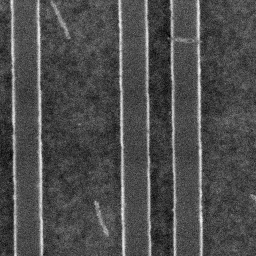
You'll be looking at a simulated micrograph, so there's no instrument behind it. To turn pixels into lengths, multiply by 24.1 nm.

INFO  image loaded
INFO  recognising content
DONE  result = lines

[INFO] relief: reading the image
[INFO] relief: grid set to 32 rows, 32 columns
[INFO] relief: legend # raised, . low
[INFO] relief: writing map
.####..........###...####.......
..###..........###...####.......
..###..........###...####.......
..###..........###...####.......
..###..........###...####.......
..###..........###...####.......
..###..........###...####.......
..###..........###...####.......
..###..........###...####.......
..###..........###....###.......
..###..........###....###.......
..###..........###....###.......
..###..........####...###.......
..###..........####...###.......
..###..........####...###.......
..###..........####...###.......
..###..........####...###.......
..###..........####...###.......
..###..........####...###.......
..###..........####...###.......
..###..........####...###.......
..###..........####...###.......
..###..........####...###.......
..###..........####...###.......
..###..........####...###.......
..###..........####...###.......
..###..........####...###.......
..###..........####...###.......
..###..........####...###.......
..###..........####...###.......
..###..........####...###.......
..###...........###...###.......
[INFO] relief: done